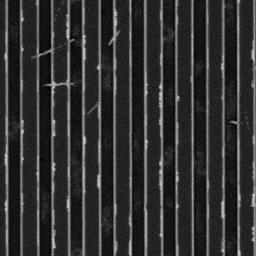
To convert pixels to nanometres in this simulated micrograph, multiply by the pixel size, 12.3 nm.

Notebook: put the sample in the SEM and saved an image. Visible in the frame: parallel lines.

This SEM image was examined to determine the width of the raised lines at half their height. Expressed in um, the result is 0.216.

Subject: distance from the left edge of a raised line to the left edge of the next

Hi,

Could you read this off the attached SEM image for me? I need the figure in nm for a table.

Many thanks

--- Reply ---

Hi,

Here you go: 380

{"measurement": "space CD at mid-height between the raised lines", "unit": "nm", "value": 169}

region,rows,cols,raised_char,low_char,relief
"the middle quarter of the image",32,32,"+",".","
+....++++....++++...++++....++++
+....++++....++++...++++....++++
+....++++....++++...++++....++++
+....++++....++++...++++....++++
++...++++....++++...++++....++++
++...++++....++++...++++....++++
+....++++....++++...++++....++++
+....++++....++++...++++....++++
+....++++....++++...++++....++++
+....++++....++++...++++....++++
+....++++....++++...++++....++++
+....++++....++++...++++....++++
+....++++....++++...++++....++++
+....++++....++++...++++....++++
+....++++....++++...++++....++++
+....++++....++++...++++....++++
+....++++....++++...++++....++++
+....++++....++++...++++....++++
+....++++....++++...++++....++++
+....++++....++++...++++....++++
+....++++....++++...++++....++++
+....++++....++++...++++....++++
+....++++....++++...++++....++++
+....++++....++++...++++....++++
+....++++....++++...++++....++++
+....++++....++++...++++....++++
+....++++....++++...++++....++++
+....++++....++++...++++....++++
+....++++....++++...++++....++++
+....++++....++++...++++....++++
+....++++....++++...++++....++++
+....++++....++++...++++....++++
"